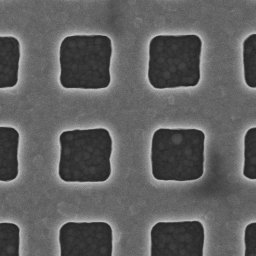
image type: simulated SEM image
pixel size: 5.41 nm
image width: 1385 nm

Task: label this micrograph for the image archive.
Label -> holes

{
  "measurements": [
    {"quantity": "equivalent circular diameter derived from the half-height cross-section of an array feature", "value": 57.3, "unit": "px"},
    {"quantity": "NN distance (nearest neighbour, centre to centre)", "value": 490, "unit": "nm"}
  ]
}